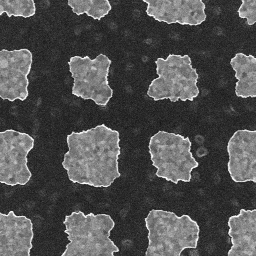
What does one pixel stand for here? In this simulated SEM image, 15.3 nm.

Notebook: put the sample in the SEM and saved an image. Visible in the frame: raised bodies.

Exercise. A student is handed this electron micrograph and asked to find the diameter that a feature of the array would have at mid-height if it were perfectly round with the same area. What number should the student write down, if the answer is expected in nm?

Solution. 727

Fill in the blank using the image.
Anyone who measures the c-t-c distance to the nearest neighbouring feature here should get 1190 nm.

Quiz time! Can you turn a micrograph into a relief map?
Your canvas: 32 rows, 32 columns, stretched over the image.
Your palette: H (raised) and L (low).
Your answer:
HHHHLLLLLHHHHHLLLLHHHHHHHLLLLLHH
HHHHLLLLLHHHHLLLLLHHHHHHHHLLLLHH
LLLLLLLLLLLLLLLLLLLLHHHHHLLLLLLH
LLLLLLLLLLLLLLLLLLLLLLLLLLLLLLLL
LLLLLLLLLLLLLLLLLLLLLLLLLLLLLLLL
LLLLLLLLLLLLLLLLLLLLLLLLLLLLLLLL
HHHHLLLLLLLLLLLLLLLLLLLLLLLLLLLL
HHHHLLLLLHHHHHLLLLLLHHHHLLLLLHHH
HHHHLLLLLHHHHHLLLLLLHHHHLLLLLHHH
HHHLLLLLLHHHHLLLLLLLHHHHHLLLLLHH
HHHLLLLLLHHHHHLLLLLHHHHHHLLLLLHH
HHHLLLLLLHHHHHLLLLLHHHHHHLLLLHHH
LHLLLLLLLLLLHHLLLLLLLHLHLLLLLLLL
LLLLLLLLLLLLLLLLLLLLLLLLLLLLLLLL
LLLLLLLLLLLLLLLLLLLLLLLLLLLLLLLL
LLLLLLLLLLLLLLLLLLLLLLLLLLLLLLLL
HHLLLLLLLLHHHHLLLLLLHLLLLLLLLLHH
HHHHLLLLHHHHHHHLLLLHHHHLLLLLLHHH
HHHHLLLLLHHHHHHLLLLHHHHHLLLLLHHH
HHHLLLLLHHHHHHHLLLLHHHHHLLLLLHHH
HHHLLLLLHHHHHHHLLLLHHHHHHLLLLHHH
HHHHLLLLHHHHHHHLLLLLHHHHLLLLLHHH
HHHHLLLLLHHHHHLLLLLLLHHHLLLLLHHH
LLLLLLLLLLLLLLLLLLLLLLLLLLLLLLLL
LLLLLLLLLLLLLLLLLLLLLLLLLLLLLLLL
LLLLLLLLLLLLLLLLLLLLLLLLLLLLLLLL
LLLLLLLLLLLLLLLLLLLHHLLLLLLLLLHH
HHHHLLLLHHHHHHLLLLHHHHHHLLLLLHHH
HHHHLLLLHHHHHHLLLLHHHHHHHLLLLHHH
HHHHLLLLLHHHHHLLLLLHHHHHHLLLLHHH
HHHHLLLLLHHHHHLLLLLHHHHHHLLLLHHH
HHHHLLLLHHHHHHLLLLHHHHHLLLLLLHHH